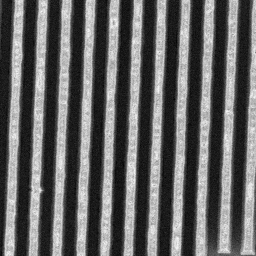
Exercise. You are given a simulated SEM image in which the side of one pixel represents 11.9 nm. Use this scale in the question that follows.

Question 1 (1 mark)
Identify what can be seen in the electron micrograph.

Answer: parallel lines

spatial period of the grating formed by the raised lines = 0.282 micrometres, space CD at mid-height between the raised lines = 13 px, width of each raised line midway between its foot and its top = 123 nanometers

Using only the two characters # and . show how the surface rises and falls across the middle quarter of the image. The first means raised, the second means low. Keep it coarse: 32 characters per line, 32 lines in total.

#....##....##....##....##....##.
#....##....##....##....##....##.
#....##....##....##....##...###.
#....##....##....##....##...###.
#....##....##....##....##...###.
#....##....##....##....##...###.
#....##....##....##....##...###.
#....##...###...###....##...###.
#....##...###...###...###...###.
#...###....##...###...###...###.
#...###...###...###...###...###.
#...###....##...###...##....###.
#...###...###...###...###...##..
#...###...###...###...###...###.
#...###...###...###...###...###.
#...###...###...###...###...###.
#...###...###...##....###...###.
#...###...###...##....##....##..
#...###...###...##....##....##..
....###...##....##....##....##..
....###...###...##....##....##..
....##....##....##....##....##..
....##....##....##....##....##..
....##....##....##....##....##..
....##....##....##....##....##..
....##....##....##....##....##..
....##....##....##....##....##..
....##....##...###....##....##..
....##....##...###...###...###..
....##....##...###...###...###..
....##....##...###...###...###..
....##....##....##...###...###..